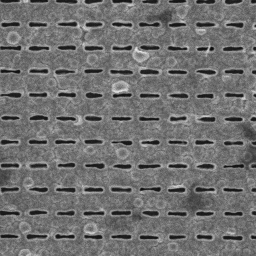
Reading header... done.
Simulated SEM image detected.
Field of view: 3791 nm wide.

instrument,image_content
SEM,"a regular array of holes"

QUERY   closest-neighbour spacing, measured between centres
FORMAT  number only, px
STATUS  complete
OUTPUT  23.5